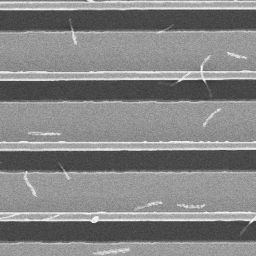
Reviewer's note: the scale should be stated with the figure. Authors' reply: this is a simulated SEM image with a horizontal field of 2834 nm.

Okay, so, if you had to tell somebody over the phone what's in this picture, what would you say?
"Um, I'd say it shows lines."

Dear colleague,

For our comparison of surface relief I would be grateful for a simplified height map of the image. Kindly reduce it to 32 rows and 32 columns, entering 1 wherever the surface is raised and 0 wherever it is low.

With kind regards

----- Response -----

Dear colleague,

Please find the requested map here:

11111111111111111111111111111111
00000000000000000000000000000000
00000000000000000000000000000000
00000000000000000000000000000000
11111111111111111111111111111111
11111111111111111111111111111111
11111111111111111111111111111111
11111111111111111111111111111111
11111111111111111111111111111111
11111111111111111111111111111111
00000000000000000000000000000000
00000000000000000000000000000000
00000000000000000000000000000000
11111111111111111111111111111111
11111111111111111111111111111111
11111111111111111111111111111111
11111111111111111111111111111111
11111111111111111111111111111111
11111111111111111111111111111111
00000000000000000000000000000000
00000000000000000000000000000000
00000000000000000000000000000000
11111111111111111111111111111111
11111111111111111111111111111111
11111111111111111111111111111111
11111111111111111111111111111111
11111111111111111111111111111111
11111111111111111111111111111111
00000000000000000000000000000000
00000000000000000000000000000000
11111111111111111111111111111111
11111111111111111111111111111111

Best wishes